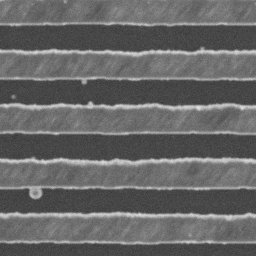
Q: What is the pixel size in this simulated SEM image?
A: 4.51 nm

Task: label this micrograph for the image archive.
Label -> lines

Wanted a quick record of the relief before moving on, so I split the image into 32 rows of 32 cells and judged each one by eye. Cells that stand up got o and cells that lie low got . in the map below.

oooooooooooooooooooooooooooooooo
oooooooooooooooooooooooooooooooo
oooooooooooooooooooooooooooooooo
................................
................................
................................
oooooooooooooooo..oooooooooooooo
oooooooooooooooooooooooooooooooo
oooooooooooooooooooooooooooooooo
oooooooooooooooooooooooooooooooo
................................
................................
................................
oooooooooooooooooooooooooooooooo
oooooooooooooooooooooooooooooooo
oooooooooooooooooooooooooooooooo
oooooooooooooooooooooooooooooooo
................................
................................
................................
oooooooooooooooooooooooooooooooo
oooooooooooooooooooooooooooooooo
oooooooooooooooooooooooooooooooo
ooooo.o.oooooooo.ooooooooooooooo
................................
................................
................................
oooooooooooooooooooooooooooooooo
oooooooooooooooooooooooooooooooo
oooooooooooooooooooooooooooooooo
................................
................................